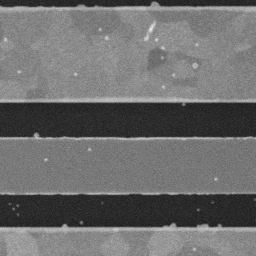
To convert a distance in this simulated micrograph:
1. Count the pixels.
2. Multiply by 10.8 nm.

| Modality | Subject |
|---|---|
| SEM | lines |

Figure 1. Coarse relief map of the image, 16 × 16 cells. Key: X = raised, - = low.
-XXXXXXXXXXXXXXX
XXXXXXXXXXXXXXXX
XXXXXXXXXXXXXXXX
XXXXXXXXXXXXXXXX
XXXXXXXXXXXXXXXX
XXXXXXXXXXXXXXXX
----------------
----------------
----------------
XXXXXXXXXXXXXXXX
XXXXXXXXXXXXXXXX
XXXXXXXXXXXXXXXX
----------------
----------------
XXXXXXXXXXXXXXXX
XXXXXXXXXXXXXXXX